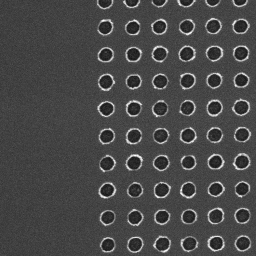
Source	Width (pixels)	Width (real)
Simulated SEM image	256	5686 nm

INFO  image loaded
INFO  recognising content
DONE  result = a regular array of holes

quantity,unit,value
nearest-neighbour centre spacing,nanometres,594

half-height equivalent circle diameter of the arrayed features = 0.304 um